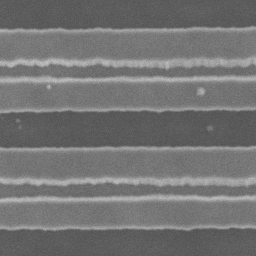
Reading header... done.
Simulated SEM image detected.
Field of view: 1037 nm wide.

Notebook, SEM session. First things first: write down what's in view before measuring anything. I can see lines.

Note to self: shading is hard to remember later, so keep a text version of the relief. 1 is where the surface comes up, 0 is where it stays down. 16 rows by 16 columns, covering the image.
0000000000000000
0000000000000000
1111111111111111
1111111111111111
1111111111111111
1111111111111111
1111111111111111
0000000000000000
0000000000000000
1111111111111111
1111111111111111
1111111111111111
1111111111111111
1111111111111111
0000000000000000
0000000000000000